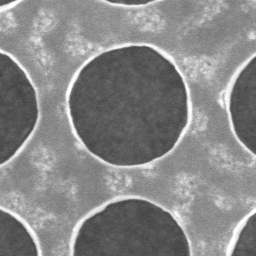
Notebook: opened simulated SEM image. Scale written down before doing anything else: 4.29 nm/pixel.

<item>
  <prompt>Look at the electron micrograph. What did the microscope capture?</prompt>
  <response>holes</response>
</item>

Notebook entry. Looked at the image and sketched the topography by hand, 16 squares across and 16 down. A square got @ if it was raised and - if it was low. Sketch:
@@@@@@@@@@@@@@@@
@@@@@@@@@@@@@@@@
@@@@@@@@@@@@@@@@
@@@@@@----@@@@@@
-@@@@------@@@@-
--@@@-------@@--
--@@--------@@--
--@@@-------@@--
--@@@------@@@@-
-@@@@@----@@@@@@
@@@@@@@@@@@@@@@@
@@@@@@@@@@@@@@@@
@@@@@@@--@@@@@@@
-@@@@@-----@@@@@
--@@@------@@@@-
--@@@-------@@--